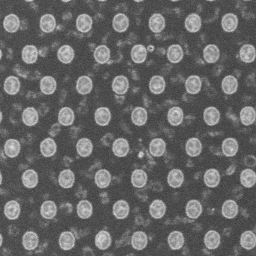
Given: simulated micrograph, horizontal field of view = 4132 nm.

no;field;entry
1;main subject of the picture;a regular array of raised bodies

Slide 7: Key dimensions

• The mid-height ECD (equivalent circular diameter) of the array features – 0.26 µm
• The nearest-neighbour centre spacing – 574 nm